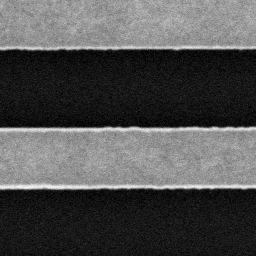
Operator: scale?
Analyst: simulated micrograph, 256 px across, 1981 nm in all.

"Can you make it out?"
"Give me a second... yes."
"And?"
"lines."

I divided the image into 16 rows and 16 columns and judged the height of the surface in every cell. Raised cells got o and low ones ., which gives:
oooooooooooooooo
oooooooooooooooo
oooooooooooooooo
................
................
................
................
................
oooooooooooooooo
oooooooooooooooo
oooooooooooooooo
oooooooooooooooo
................
................
................
................